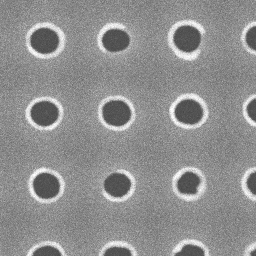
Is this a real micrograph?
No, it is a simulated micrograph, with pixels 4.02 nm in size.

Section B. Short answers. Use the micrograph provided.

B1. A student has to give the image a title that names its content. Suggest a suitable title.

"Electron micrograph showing a regular array of holes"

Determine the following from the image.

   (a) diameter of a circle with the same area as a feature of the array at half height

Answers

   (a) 107 nanometers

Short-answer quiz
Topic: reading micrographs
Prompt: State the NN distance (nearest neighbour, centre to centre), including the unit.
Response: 287 nm